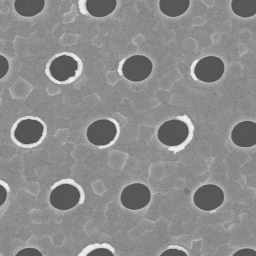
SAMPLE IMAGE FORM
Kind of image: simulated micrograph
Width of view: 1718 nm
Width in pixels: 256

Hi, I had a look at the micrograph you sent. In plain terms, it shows a regular array of holes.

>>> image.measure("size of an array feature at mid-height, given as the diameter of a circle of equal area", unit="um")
0.188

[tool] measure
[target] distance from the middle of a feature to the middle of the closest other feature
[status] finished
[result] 486 nm